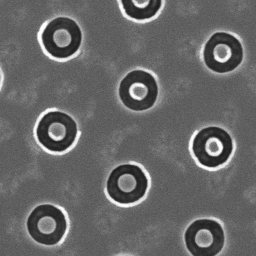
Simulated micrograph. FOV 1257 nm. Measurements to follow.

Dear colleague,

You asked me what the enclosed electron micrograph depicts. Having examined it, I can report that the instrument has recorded ring-shaped grooves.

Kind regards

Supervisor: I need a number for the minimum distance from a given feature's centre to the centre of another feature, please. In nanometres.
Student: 449